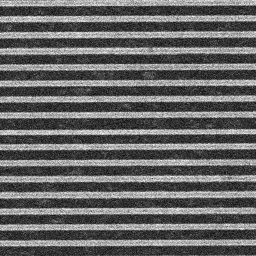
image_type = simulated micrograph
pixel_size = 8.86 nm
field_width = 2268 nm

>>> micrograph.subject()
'parallel lines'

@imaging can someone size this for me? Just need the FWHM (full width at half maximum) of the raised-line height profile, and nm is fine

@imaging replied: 46.5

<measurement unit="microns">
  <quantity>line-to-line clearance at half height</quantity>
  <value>0.0941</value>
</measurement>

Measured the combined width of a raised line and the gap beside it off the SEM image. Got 142 nanometers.